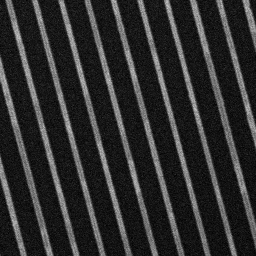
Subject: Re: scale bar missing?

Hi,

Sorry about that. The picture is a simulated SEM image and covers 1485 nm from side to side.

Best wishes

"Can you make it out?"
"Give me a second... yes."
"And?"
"parallel lines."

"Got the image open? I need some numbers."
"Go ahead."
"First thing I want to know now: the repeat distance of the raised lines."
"148 nm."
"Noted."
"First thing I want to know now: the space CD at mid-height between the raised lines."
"122 nm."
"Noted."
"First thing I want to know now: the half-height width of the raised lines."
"23.1 nm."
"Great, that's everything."